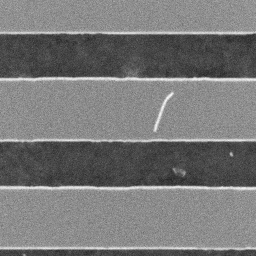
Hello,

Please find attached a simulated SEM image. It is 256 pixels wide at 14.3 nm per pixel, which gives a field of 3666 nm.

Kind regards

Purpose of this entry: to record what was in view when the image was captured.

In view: lines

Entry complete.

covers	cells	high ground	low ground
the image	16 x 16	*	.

****************
****************
................
................
................
****************
****************
****************
****************
................
................
................
****************
****************
****************
****************